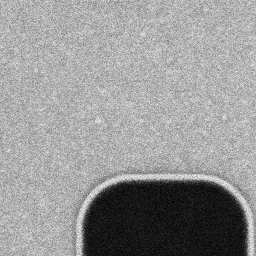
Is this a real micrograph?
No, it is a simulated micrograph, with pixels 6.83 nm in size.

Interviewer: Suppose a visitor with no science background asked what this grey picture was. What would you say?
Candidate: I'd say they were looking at one or a few lines or trenches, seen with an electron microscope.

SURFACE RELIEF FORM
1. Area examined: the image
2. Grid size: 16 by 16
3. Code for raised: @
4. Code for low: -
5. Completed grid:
----------------
----------------
----------------
----------------
----------------
----------------
----------------
----------------
----------------
----------------
----------------
------@@@@@@@@--
-----@@@@@@@@@@-
-----@@@@@@@@@@@
-----@@@@@@@@@@@
-----@@@@@@@@@@@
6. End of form